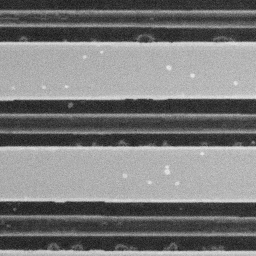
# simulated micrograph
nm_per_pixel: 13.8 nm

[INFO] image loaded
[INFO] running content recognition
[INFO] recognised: lines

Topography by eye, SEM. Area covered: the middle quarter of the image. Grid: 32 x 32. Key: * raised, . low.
********************************
********************************
********************************
********************************
********************************
********************************
********************************
********************************
********************************
................................
................................
................................
................................
********************************
********************************
********************************
********************************
................................
................................
................................
................................
********************************
********************************
********************************
********************************
********************************
********************************
********************************
********************************
********************************
********************************
********************************